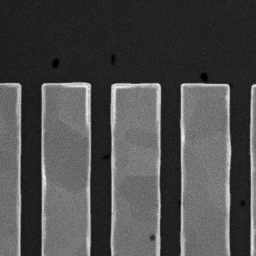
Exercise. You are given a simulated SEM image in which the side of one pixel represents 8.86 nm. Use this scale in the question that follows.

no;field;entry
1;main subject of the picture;wiring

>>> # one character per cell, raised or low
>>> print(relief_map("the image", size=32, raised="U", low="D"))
DDDDDDDDDDDDDDDDDDDDDDDDDDDDDDDD
DDDDDDDDDDDDDDDDDDDDDDDDDDDDDDDD
DDDDDDDDDDDDDDDDDDDDDDDDDDDDDDDD
DDDDDDDDDDDDDDDDDDDDDDDDDDDDDDDD
DDDDDDDDDDDDDDDDDDDDDDDDDDDDDDDD
DDDDDDDDDDDDDDDDDDDDDDDDDDDDDDDD
DDDDDDDDDDDDDDDDDDDDDDDDDDDDDDDD
DDDDDDDDDDDDDDDDDDDDDDDDDDDDDDDD
DDDDDDDDDDDDDDDDDDDDDDDDDDDDDDDD
DDDDDDDDDDDDDDDDDDDDDDDDDDDDDDDD
UUDDDDUUUUUDDDUUUUUUDDDUUUDDDDDD
UUUDDUUUUUUDDDUUUUUUDDDUUUUUUDDU
UUUDDUUUUUUDDDUUUUUUDDDUUUUUUDDU
UUUDDUUUUUUDDDUUUUUUDDDUUUUUUDDU
UUUDDUUUUUUDDDUUUUUUDDDUUUUUUDDU
UUUDDUUUUUUDDDUUUUUUDDDUUUUUUDDU
UUUDDUUUUUUDDDUUUUUUDDDUUUUUUDDU
UUUDDUUUUUUDDDUUUUUUDDDUUUUUUDDU
UUUDDUUUUUUDDDUUUUUUDDDUUUUUUDDU
UUUDDUUUUUUDDDUUUUUUDDDUUUUUUDDU
UUDDDUUUUUUDDDUUUUUUDDDUUUUUUDDU
UUDDDUUUUUUDDDUUUUUUDDDUUUUUUDDU
UUDDDDDDUUUDDDUUUUUUDDDUUUUUUDDU
UUDDDUDDDUUDDDUUUUUUDDDUUUUUUDDU
UUUDDUUUUDUDDDUUUUUUDDDUUUUUUDDU
UUUDDUUUUUUDDDUUUUUUDDDUUUUUUDDU
UUUDDUUUUUUDDDUUUUUUDDDUUUUUUDDU
UUDDDUUUUUUDDDUUUUUUDDDUUUUUUDDU
UUDDDUUUUUUDDDUUUUUUDDDUUUUUUDDU
UUDDDUUUUUUDDDUUUUUUDDDUUUUUUDDU
UUDDDUUUUUUDDDUUUUUUDDDUUUUUUDDU
UUDDDUUUUUUDDDUUUUUUDDDUUUUUUDDU